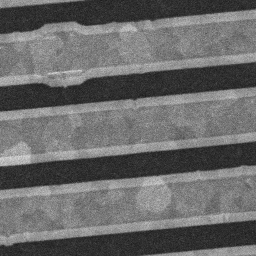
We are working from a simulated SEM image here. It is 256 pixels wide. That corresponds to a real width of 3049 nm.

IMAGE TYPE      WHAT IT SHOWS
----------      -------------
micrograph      one or a few lines or trenches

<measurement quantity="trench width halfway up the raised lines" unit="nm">406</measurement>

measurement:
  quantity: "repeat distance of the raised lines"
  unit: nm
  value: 932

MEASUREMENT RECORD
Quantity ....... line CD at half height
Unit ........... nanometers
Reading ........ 533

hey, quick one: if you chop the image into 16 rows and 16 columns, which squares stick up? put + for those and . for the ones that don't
................
..........++++++
++++++++++++++++
++++++++++++++++
++++++..........
................
........++++++++
++++++++++++++++
++++++++++++++++
++++++..........
................
........++++++++
++++++++++++++++
+++++++++++++++.
+++++...........
................